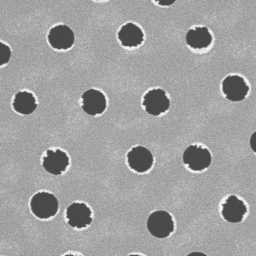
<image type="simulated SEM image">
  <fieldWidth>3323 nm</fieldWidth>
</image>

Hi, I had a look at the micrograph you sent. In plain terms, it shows a regular array of holes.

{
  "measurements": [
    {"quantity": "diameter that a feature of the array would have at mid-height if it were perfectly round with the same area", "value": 330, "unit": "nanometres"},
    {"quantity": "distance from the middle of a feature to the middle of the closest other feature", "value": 803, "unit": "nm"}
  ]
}